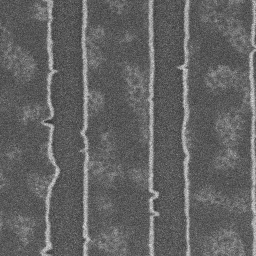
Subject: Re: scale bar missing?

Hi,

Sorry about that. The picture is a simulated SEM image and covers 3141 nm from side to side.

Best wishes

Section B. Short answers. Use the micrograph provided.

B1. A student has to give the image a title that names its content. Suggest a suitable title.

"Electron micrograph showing one or a few lines or trenches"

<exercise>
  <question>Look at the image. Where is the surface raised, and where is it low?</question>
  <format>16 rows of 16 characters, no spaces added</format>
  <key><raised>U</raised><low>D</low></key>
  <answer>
UUUDDUUUUDDDUUUU
UUUDDUUUUDDDUUUU
UUUDDUUUUDDDUUUU
UUUDDUUUUUDDUUUU
UUUDDUUUUUDUUUUU
UUUDDUUUUDDDUUUU
UUUDDUUUUDDDUUUU
UUUDDUUUUDDDUUUU
UUUDDUUUUDDUUUUU
UUUDDUUUUDDDUUUU
UUUDDUUUUDDDUUUU
UUUDDUUUUDDDUUUU
UUUDDUUUUUDDUUUU
UUUDDUUUUUDDUUUU
UUUDDUUUUDDDUUUU
UUUDDUUUUDDDUUUU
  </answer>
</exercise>